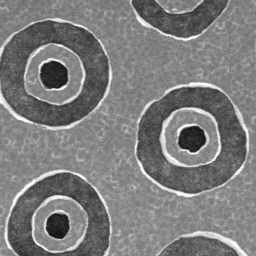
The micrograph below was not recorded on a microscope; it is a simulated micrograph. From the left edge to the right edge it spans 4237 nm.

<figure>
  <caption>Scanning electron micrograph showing ring-shaped grooves with a dot in the middle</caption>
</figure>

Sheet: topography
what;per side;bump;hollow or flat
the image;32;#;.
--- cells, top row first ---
#################...#####...####
#################....###....####
##################.........#####
###.......#########.......######
##..........##########..########
#.....#......###################
.....####....###################
....######....##################
...##...##....##################
...##...###...##################
...##...##....##################
...#######...########.......####
.....####....#######.........###
#...........######.....##.....##
##.........#######...######...##
#####....########...#######...##
#################...###..##....#
#################...##....#....#
#################...###..###...#
#################....######....#
##################....####....##
##################............##
#####......########..........###
####........#########......#####
##.....#....####################
##...#####...###################
#...#######..###################
#...##...##...##################
#...##...##...##################
#...##..##....#########....#####
#....#####....#######........###
##....##.....#######..........##